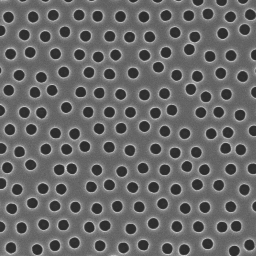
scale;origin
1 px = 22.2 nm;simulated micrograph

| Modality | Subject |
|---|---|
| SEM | a regular array of holes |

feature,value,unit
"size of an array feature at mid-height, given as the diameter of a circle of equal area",244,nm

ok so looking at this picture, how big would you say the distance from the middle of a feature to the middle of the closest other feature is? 417 nanometres